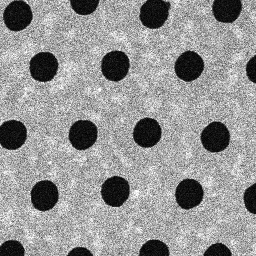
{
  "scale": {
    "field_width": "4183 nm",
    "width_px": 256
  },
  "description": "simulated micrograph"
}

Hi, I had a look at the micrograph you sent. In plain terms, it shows a regular array of holes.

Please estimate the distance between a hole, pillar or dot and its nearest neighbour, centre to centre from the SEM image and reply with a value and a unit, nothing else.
1070 nm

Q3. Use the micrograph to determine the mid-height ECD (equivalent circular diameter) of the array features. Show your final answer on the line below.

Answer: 490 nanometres